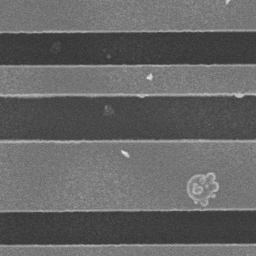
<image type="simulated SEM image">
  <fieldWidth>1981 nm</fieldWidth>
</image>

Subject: lines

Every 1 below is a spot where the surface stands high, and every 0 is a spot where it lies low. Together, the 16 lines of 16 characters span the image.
1111111111111111
1111111111111111
0000000000000000
0000000000000000
1111111111111111
1111111111111111
0000000000000000
0000000000000000
0000000000000000
1111111111111111
1111111111111111
1111111111111111
1111111111111111
0000000000000000
0000000000000000
1111111111111111